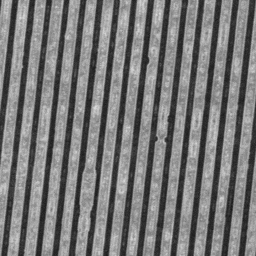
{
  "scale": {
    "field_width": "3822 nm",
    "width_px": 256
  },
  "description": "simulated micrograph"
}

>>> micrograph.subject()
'parallel lines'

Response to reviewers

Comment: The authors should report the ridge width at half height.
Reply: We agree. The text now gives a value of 9.44 px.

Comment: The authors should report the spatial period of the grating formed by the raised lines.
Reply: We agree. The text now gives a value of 251 nm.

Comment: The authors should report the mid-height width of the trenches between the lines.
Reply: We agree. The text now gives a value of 111 nm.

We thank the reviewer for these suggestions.